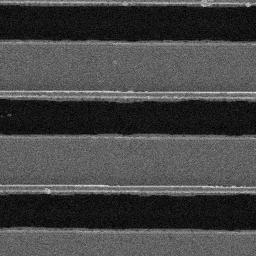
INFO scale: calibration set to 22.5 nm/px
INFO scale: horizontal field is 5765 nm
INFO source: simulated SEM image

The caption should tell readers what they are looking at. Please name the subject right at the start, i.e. lines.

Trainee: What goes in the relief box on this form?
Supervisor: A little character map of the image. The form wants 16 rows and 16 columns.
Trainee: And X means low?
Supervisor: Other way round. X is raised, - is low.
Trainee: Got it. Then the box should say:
----------------
----------------
----------------
XXXXXXXXXXXXXXXX
XXXXXXXXXXXXXXXX
XXXXXXXXXXXXXXXX
----------------
----------------
----------------
XXXXXXXXXXXXXXXX
XXXXXXXXXXXXXXXX
XXXXXXXXXXXXXXXX
----------------
----------------
XXXXXXXXXXXXX---
XXXXXXXXXXXXXXXX